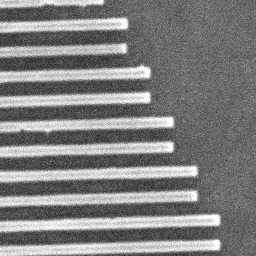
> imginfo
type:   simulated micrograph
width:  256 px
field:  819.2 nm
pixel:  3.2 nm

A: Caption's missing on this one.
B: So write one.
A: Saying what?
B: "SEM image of parallel lines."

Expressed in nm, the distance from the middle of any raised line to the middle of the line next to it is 79.8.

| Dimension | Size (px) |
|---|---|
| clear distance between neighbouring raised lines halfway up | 16.9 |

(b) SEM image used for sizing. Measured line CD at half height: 26.8 nm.